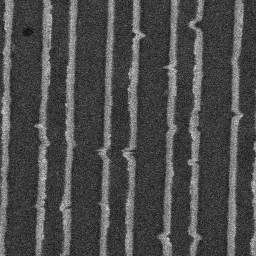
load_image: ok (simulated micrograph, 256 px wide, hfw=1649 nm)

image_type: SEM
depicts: one or a few lines or trenches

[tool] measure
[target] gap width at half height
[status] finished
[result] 232 nanometers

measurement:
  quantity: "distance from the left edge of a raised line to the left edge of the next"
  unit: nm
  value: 408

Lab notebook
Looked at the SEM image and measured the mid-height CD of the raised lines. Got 180 nm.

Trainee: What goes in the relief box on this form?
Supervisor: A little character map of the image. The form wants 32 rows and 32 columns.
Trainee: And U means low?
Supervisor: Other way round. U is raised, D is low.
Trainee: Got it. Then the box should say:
UDDDDDUUUDDDDDUUUDDDDDUUUDDDDDUU
UDDDDDUUUDDDDDUUUDDDDDUUUDDDDDUU
UDDDDDUUUDDDDDUUUDDDDDUUUDDDDDUU
UDDDDDUUUDDDDDUUUDDDDDUUDDDDDDUU
UDDDDDUUUDDDDDUUUUDDDDUUUDDDDDUU
UDDDDDUUUDDDDDUUUDDDDDUUUDDDDDUU
UDDDDDUUUDDDDDUUUDDDDDUUUDDDDUUU
UDDDDDUUUDDDDDUUUDDDDDUUUDDDDUUU
UDDDDDUUUDDDDDUUUDDDDUUUUDDDDUUU
UDDDDDUUUDDDDDUUUDDDDUUUUDDDDUUU
UDDDDDUUUDDDDDUUUDDDDUUUUDDDDUUU
UDDDDDUUUDDDDUUUUDDDDUUUUDDDDUUU
UDDDDUUUUDDDDUUUUDDDDUUUUDDDDUUU
UDDDDUUUUDDDDUUUUDDDDUUUUDDDDUUU
UDDDDUUUUDDDDUUUUDDDDUUUUDDDDDUU
UDDDDUUUUDDDDUUUUDDDDUUUUDDDDUUU
UDDDDUUUUDDDDUUUUDDDDUUUUDDDDUUU
UDDDDUUUUDDDDUUUUDDDDUUUUDDDDUUU
UDDDDUUUUDDDDUUUDDDDDUUUUDDDDUUU
UDDDDUUUUDDDDUUUDDDDDUUUDDDDDUUU
UDDDDUUUUDDDDUUUUDDDDUUUDDDDDUUU
UDDDDUUUUDDDDUUUUDDDDUUUDDDDDUUU
UDDDDUUUUDDDDUUUUDDDDUUUDDDDDUUU
UDDDDUUUUDDDDUUUDDDDDUUUDDDDDUUU
UDDDDUUUDDDDDUUUDDDDDUUUDDDDDUUU
UDDDDUUUDDDDDUUUDDDDDUUUDDDDDUUU
DDDDDUUUDDDDDUUUDDDDDUUUDDDDDUUU
DDDDDUUUUDDDDUUUDDDDDUUUDDDDDUUU
DDDDDUUUDDDDDUUUDDDDDUUUDDDDDUUU
DDDDDUUUDDDDDUUUDDDDUUUUUDDDDUUU
DDDDDUUUDDDDDUUUDDDDDUUUDDDDDUUU
DDDDDUUUDDDDDUUUDDDDDUUUDDDDDUUU